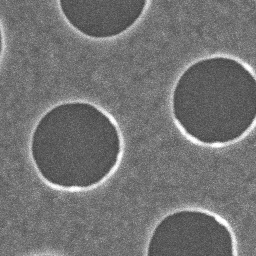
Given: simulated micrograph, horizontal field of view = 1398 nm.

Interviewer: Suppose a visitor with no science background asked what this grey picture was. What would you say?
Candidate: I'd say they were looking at holes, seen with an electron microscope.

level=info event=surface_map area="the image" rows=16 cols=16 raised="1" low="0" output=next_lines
1111000001111111
1111000011111111
1111111111111111
1111111111111111
1111111111110000
1111111111100000
1111011111100000
1110000111100000
1100000111110001
1100000111111111
1100000111111111
1110001111111111
1111111111111111
1111111111100111
1111111111000011
1111111110000001